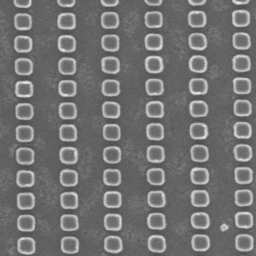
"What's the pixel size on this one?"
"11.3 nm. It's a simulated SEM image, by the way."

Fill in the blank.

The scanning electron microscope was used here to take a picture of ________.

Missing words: a regular array of raised bodies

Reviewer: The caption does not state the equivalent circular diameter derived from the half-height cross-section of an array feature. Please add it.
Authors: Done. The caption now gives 199 nm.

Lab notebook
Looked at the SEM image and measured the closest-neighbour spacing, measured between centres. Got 252 nm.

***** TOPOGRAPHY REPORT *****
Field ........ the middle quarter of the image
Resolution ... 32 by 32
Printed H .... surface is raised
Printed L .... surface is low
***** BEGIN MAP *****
HHHLLLLLLLHHHHLLLLLLLHHHHLLLLLLL
HHHLLLLLLLHHHHLLLLLLLHHHLLLLLLLL
LLLLLLLLLLLLLLLLLLLLLLLLLLLLLLLL
LLLLLLLLLLLLLLLLLLLLLLLLLLLLLLLL
HHLLLLLLLLHHHLLLLLLLLHHHLLLLLLLL
HHHLLLLLLLHHHHLLLLLLLHHHHLLLLLLL
HHHLLLLLLLHHHHLLLLLLLHHHHLLLLLLL
HHHLLLLLLLHHHLLLLLLLLHHHLLLLLLLL
LLLLLLLLLLLLLLLLLLLLLLLLLLLLLLLL
LLLLLLLLLLLLLLLLLLLLLLLLLLLLLLLL
HHHLLLLLLLHHHHLLLLLLLHHHHLLLLLLL
HHHLLLLLLLHHHHLLLLLLLHHHHLLLLLLL
HHHLLLLLLLHHHHLLLLLLLHHHHLLLLLLL
HHLLLLLLLLLLLLLLLLLLLLLLLLLLLLLL
LLLLLLLLLLLLLLLLLLLLLLLLLLLLLLLL
HHLLLLLLLLHHHLLLLLLLLHHHHLLLLLLL
HHHLLLLLLLHHHHLLLLLLLHHHHLLLLLLL
HHHLLLLLLLHHHHLLLLLLLHHHHLLLLLLL
HHHLLLLLLLHHHHLLLLLLLHHHHLLLLLLL
LLLLLLLLLLLLLLLLLLLLLLLLLLLLLLLL
LLLLLLLLLLLLLLLLLLLLLLLLLLLLLLLL
HHHLLLLLLLHHHHLLLLLLLHHHHLLLLLLL
HHHLLLLLLLHHHHLLLLLLLHHHHLLLLLLL
HHHLLLLLLLHHHHLLLLLLLHHHHLLLLLLL
HHHLLLLLLLLHHHLLLLLLLLLLLLLLLLLL
LLLLLLLLLLLLLLLLLLLLLLLLLLLLLLLL
LLLLLLLLLLHHHLLLLLLLLLHHHLLLLLLL
HHHLLLLLLLHHHHLLLLLLLHHHHLLLLLLL
HHHLLLLLLLHHHHLLLLLLLHHHHLLLLLLL
HHHLLLLLLLHHHHLLLLLLLHHHHLLLLLLL
LLLLLLLLLLLLLLLLLLLLLLLLLLLLLLLL
LLLLLLLLLLLLLLLLLLLLLLLLLLLLLLLL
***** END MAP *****